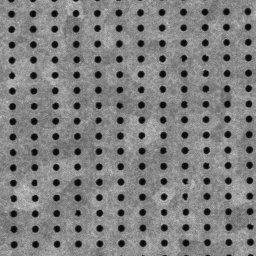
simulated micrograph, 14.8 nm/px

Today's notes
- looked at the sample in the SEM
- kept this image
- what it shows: a regular array of holes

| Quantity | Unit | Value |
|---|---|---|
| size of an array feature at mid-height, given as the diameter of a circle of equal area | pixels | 6.68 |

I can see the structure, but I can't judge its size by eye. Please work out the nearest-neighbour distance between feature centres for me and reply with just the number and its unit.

225 nanometres